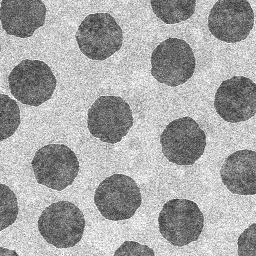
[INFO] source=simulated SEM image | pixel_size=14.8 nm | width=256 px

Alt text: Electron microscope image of a regular array of holes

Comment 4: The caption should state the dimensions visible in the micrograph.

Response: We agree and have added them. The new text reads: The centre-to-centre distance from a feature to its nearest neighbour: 1030 nm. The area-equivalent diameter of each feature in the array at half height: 0.703 micrometres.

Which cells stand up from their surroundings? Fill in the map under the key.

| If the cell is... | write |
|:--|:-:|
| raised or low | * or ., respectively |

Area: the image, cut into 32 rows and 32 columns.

......*************.....***....*
......*************.....**......
......****....******...***......
.....*****.....***********......
**..*****......************....*
**********.....*****....********
**********.....****.....********
***..*******.******.....********
**....*************.....********
*......************.....********
*......*************...*****....
*......********************.....
......******...************.....
..*********.....***********.....
...********......**********.....
...********......****....*******
..*********.....****.....*******
.***********...*****......******
*****....***********......******
****......***********....***....
****......************..****....
****......******************....
****.....****....***********....
.*****..****.....***********....
..**********......**************
..****...***......***....*******
..***.....**.....***.....*******
..***......***.*****......******
.****......*********.....******.
*****.....**********.....*****..
******....*****...***...******..
..************.....***********..